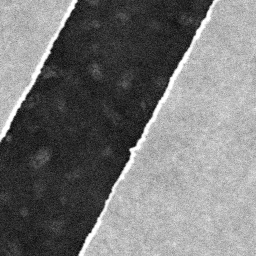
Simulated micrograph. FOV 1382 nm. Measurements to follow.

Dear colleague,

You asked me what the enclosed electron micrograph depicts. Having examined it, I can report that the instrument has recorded one or a few lines or trenches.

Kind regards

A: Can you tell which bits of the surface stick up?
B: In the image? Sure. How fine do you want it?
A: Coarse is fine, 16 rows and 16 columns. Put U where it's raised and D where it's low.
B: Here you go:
UUUUUDDDDDDDDUUU
UUUUDDDDDDDDDUUU
UUUDDDDDDDDDUUUU
UUUDDDDDDDDDUUUU
UUDDDDDDDDDUUUUU
UUDDDDDDDDUUUUUU
UDDDDDDDDDUUUUUU
UDDDDDDDDUUUUUUU
DDDDDDDDDUUUUUUU
DDDDDDDDUUUUUUUU
DDDDDDDDUUUUUUUU
DDDDDDDUUUUUUUUU
DDDDDDDUUUUUUUUU
DDDDDDUUUUUUUUUU
DDDDDDUUUUUUUUUU
DDDDDUUUUUUUUUUU